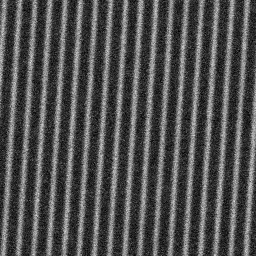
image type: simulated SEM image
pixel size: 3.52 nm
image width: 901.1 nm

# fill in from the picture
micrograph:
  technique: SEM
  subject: parallel lines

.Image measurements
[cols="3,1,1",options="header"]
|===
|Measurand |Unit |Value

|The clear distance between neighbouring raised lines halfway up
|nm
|40.3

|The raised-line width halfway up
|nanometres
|13.2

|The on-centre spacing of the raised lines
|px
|15.1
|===